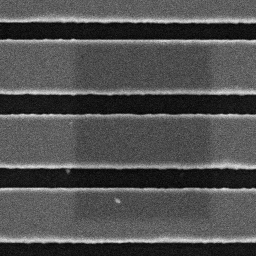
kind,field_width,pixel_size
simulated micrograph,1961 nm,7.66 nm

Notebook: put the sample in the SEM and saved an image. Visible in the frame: lines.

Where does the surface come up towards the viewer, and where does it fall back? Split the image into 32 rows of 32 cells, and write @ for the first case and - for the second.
@@@@@@@@@@@@@@@@@@@@@@@@@@@@@@@@
@@@@@@@@@@@@@@@@@@@@@@@@@@@@@@@@
@@@@@@@@@@@@@@@@@@@@@@@@@@@@@@@@
--------------------------------
--------------------------------
@@@@@@@@@@@@@@@@@@@@@@@@@@@@@@@@
@@@@@@@@@@@@@@@@@@@@@@@@@@@@@@@@
@@@@@@@@@@@@@@@@@@@@@@@@@@@@@@@@
@@@@@@@@@@@@@@@@@@@@@@@@@@@@@@@@
@@@@@@@@@@@@@@@@@@@@@@@@@@@@@@@@
@@@@@@@@@@@@@@@@@@@@@@@@@@@@@@@@
@@@@@@@@@@@@@@@@@@@@@@@@@@@@@@@@
--------------------------------
--------------------------------
@@@@@@@@@@@@@@@@@@@@@@@@@@@@@@@@
@@@@@@@@@@@@@@@@@@@@@@@@@@@@@@@@
@@@@@@@@@@@@@@@@@@@@@@@@@@@@@@@@
@@@@@@@@@@@@@@@@@@@@@@@@@@@@@@@@
@@@@@@@@@@@@@@@@@@@@@@@@@@@@@@@@
@@@@@@@@@@@@@@@@@@@@@@@@@@@@@@@@
@@@@@@@@@@@@@@@@@@@@@@@@@@@@@@@@
--------------------------------
--------------------------------
--------------------------------
@@@@@@@@@@@@@@@@@@@@@@@@@@@@@@@@
@@@@@@@@@@@@@@@@@@@@@@@@@@@@@@@@
@@@@@@@@@@@@@@@@@@@@@@@@@@@@@@@@
@@@@@@@@@@@@@@@@@@@@@@@@@@@@@@@@
@@@@@@@@@@@@@@@@@@@@@@@@@@@@@@@@
@@@@@@@@@@@@@@@@@@@@@@@@@@@@@@@@
--------------------------------
--------------------------------